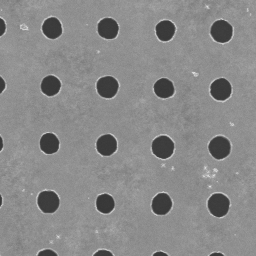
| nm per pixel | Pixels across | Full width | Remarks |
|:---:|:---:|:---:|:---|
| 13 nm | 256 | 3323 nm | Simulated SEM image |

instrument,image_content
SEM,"a regular array of holes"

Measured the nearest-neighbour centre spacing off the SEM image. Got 56.6 px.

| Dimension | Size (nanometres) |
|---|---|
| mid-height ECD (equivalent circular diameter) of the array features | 277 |